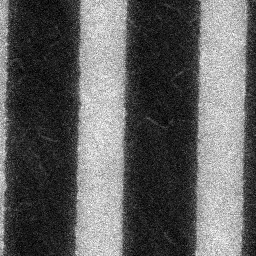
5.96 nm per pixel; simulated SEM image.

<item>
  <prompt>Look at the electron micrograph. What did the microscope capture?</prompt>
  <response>one or a few lines or trenches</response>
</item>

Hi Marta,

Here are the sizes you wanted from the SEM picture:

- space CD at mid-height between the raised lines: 262 nanometers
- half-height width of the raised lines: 447 nanometers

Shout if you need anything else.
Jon